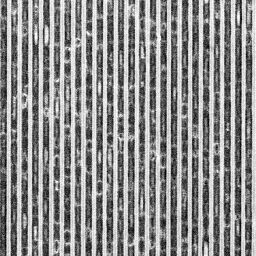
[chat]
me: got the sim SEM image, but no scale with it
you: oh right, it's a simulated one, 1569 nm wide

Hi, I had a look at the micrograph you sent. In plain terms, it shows parallel lines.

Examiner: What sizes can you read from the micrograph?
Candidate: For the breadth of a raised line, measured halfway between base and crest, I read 20.7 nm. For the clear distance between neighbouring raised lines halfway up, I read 46.7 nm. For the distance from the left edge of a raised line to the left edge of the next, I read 65.4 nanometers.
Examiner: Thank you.